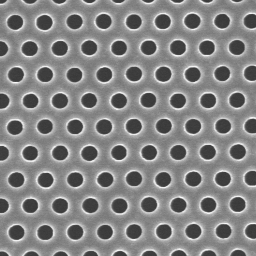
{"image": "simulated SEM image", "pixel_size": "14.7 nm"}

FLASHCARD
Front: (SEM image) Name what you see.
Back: a regular array of holes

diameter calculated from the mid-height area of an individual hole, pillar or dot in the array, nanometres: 232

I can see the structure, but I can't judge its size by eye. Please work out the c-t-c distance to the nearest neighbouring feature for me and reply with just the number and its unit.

432 nanometres